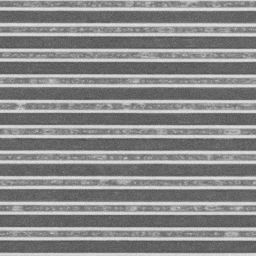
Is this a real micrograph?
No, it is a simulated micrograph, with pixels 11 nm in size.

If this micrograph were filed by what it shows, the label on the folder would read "parallel lines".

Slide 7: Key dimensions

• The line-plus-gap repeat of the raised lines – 0.28 microns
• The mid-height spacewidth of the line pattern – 15.9 px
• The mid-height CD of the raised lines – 108 nm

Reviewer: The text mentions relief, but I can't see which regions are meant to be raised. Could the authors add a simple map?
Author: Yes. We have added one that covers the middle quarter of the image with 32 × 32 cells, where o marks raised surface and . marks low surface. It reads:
................................
................................
................................
oooooooooooooooooooooooooooooooo
oooooooooooooooooooooooooooooooo
................................
................................
................................
................................
ooo....ooooooooooooooooooooooooo
oooooooooooooooooooooooooooooooo
oooooooooooooooooooooooooooooooo
................................
................................
................................
................................
oooooooooooooooooooooooooooooooo
oooooooooooooooooooooooooooooooo
................................
................................
................................
................................
oooooooooooooooooooooooooooooooo
oooooooooooooooooooooooooooooooo
.......ooooooooooooooooooooooooo
................................
................................
................................
ooooooooooooooooooooo..ooo......
oooooooooooooooooooooooooooooooo
oooooooooooooooooooooooooooooooo
................................